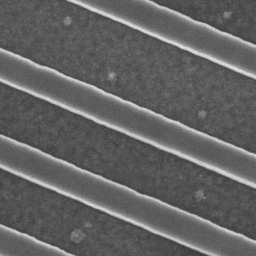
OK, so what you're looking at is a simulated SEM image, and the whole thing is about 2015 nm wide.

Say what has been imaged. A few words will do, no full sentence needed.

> lines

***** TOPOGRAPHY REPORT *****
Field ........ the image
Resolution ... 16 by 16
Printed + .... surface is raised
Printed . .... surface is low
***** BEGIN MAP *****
.....+++++......
........+++++...
..........+++++.
+............+++
++++...........+
.+++++..........
....++++........
......+++++.....
........+++++...
+++........+++++
+++++........+++
..+++++........+
.....+++++......
.......+++++....
+.........+++++.
++++........++++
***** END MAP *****